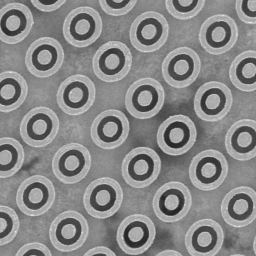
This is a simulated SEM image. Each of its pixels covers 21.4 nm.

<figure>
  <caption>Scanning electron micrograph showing a regular array of ring-shaped raised bodies with a dot in the middle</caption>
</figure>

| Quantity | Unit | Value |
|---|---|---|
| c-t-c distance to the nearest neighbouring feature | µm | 1.01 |